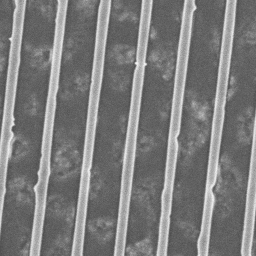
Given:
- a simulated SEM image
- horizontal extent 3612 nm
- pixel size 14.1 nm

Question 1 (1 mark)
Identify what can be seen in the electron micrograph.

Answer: parallel lines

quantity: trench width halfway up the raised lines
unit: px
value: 32.7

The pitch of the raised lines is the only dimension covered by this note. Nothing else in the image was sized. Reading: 41.9 px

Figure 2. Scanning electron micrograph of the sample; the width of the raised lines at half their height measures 137 nanometres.